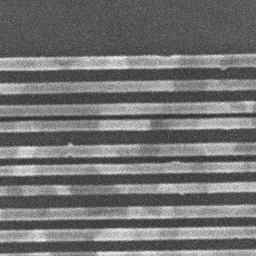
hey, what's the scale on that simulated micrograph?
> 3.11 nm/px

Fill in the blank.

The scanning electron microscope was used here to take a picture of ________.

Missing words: parallel lines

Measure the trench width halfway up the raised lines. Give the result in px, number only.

11.9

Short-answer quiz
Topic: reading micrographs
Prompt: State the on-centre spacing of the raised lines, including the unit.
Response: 66.7 nm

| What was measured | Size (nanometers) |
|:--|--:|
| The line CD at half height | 31.4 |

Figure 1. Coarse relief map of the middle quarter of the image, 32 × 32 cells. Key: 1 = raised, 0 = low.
11111111111111111111111111111111
00000000000000000000000000000000
00000000000000000000000000000000
00000000000000000000000000000000
00000000000001111111111111111111
11111111111111111111111111111111
11111111111111111111111111111111
00000000000000000000000000000000
00000000000000000000000000000000
00000000000000000000000000000000
11111111111111111111111111111111
11111111111111111111111111111111
11111111111111100000000000000000
00000000000000000000000000000000
11111111111111111111111111111111
11111111111111111111111111111111
11110000000000000000000000000000
00000000000000000000000000000000
00000000000000000000000000000000
00000000000000000000000000000000
01000001111111111111111111111111
11111111111111111111111111111111
11111111111111111111111111111111
00000000000000000000000000000000
00000000000000000000000000000000
11111111111111111111111111111111
11111111111111111111111111111111
00000000000000000000000000000000
00000000000000000000000000000000
00000000000000000000000000000000
00001111110000011111111111111111
11111111111111111111111111111111